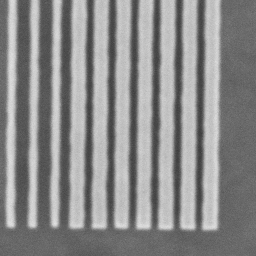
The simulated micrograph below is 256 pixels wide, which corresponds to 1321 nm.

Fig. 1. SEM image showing groups of lines, slits or small figures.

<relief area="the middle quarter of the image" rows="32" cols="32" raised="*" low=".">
..***...***..***...***..***...**
..***...***..***...***..***...**
..***...***..***...***..****..**
..***...***..***...***..****..**
..***...***..***...***..***...**
..***...***..***...***..***...**
..***...***..***...***..****..**
..***...***..***...***..****..**
..***...***..***...***..****..**
..***...***..***...***..***...**
..***...***..***...***..***...**
..***...***..***...***..***...**
..***...***..***...***..***...**
..***...***..***...***..***...**
..***...***..***...***..***...**
..***..***...***...***..***...**
..***..***...***...***..***...**
..***..***...***...***..***...**
..***..****..***...***..***...**
..***...***..***..****..***...**
..***...***..***..****..***...**
..***...**...***..****..***...**
..***..***...***..****..***...**
..***..****..***...***..***...**
..***..****..***...***..***..***
..***..****..***..****..***..***
..***..****..***..****..***...**
..***...**...***...***..***...**
..***..***...***..****..***..***
..***..***...***..***...***...**
..***..***...***..***...***..***
..***..***...***..***...***..***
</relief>